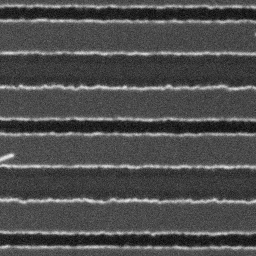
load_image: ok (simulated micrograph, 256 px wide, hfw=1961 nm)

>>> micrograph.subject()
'lines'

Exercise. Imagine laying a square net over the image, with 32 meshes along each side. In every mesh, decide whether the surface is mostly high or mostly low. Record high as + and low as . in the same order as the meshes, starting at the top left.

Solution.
++++++++++++++++++++++++++++++++
................................
..+.++..........................
++++++++++++++++++++++++++++++++
++++++++++++++++++++++++++++++++
++++++++++++++++++++++++++++++++
++++++++++++++++++++++++++++++++
................................
................................
................................
................................
++++++++++++++++++++++++++++++++
++++++++++++++++++++++++++++++++
++++++++++++++++++++++++++++++++
++++++++++++++++++++++++++++++++
................................
................................
++++++++++++++++++++++++++++++++
++++++++++++++++++++++++++++++++
++++++++++++++++++++++++++++++++
++++++++++++++++++++++++++++++++
................................
................................
................................
................................
++++++++++++++++++++++++++++++++
++++++++++++++++++++++++++++++++
++++++++++++++++++++++++++++++++
++++++++++++++++++++++++++++++++
................................
................................
++++++++++++++++++++++++++++++++